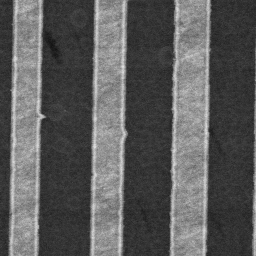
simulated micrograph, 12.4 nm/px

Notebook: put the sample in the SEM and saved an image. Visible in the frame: one or a few lines or trenches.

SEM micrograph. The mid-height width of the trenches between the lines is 654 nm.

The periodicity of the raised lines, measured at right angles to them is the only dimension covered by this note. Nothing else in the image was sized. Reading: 1020 nanometres